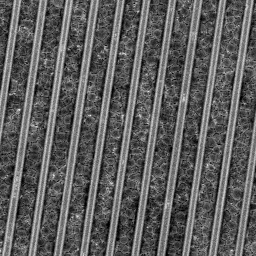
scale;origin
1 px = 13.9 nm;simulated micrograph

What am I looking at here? parallel lines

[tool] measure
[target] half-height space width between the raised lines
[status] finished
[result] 264 nm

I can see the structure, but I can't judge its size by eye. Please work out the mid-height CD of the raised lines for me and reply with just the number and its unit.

92.6 nanometres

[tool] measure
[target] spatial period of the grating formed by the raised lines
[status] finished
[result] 354 nanometres